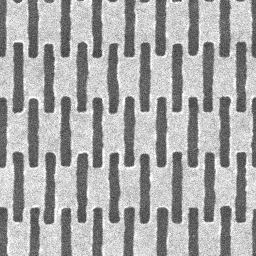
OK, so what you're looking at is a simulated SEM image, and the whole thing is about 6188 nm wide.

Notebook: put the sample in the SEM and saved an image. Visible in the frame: a regular array of holes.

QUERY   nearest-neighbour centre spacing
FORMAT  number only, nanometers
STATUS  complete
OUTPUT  765